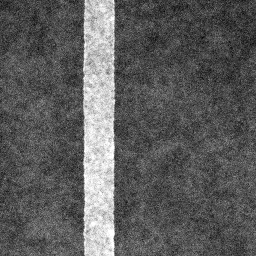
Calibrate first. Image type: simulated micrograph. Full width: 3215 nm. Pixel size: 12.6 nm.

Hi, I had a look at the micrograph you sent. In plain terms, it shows one or a few lines or trenches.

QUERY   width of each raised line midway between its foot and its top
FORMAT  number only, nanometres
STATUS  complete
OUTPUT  361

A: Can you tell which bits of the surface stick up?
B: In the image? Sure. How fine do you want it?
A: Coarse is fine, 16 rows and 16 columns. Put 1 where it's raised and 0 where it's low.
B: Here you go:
0000011000000000
0000011000000000
0000011000000000
0000011000000000
0000011000000000
0000011000000000
0000011000000000
0000011000000000
0000011000000000
0000011000000000
0000011000000000
0000011000000000
0000011000000000
0000011000000000
0000011000000000
0000011000000000